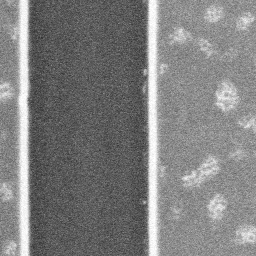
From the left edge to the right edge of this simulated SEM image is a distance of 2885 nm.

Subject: one or a few lines or trenches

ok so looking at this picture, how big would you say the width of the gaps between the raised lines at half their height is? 1.45 um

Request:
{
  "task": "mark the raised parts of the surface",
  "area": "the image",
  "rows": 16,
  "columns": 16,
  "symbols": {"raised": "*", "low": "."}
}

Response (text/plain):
*.........******
*.........******
*.........******
*.........******
*.........******
*.........******
*.........******
*.........******
*.........******
*.........******
*.........******
*.........******
*.........******
**........******
**........******
**........******